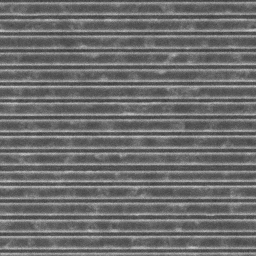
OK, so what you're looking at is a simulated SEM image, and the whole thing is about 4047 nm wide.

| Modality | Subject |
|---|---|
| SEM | parallel lines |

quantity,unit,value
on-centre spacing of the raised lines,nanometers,264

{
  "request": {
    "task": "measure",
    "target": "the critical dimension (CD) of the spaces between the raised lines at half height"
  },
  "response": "65.2 nanometres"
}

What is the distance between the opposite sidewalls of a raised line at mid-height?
0.192 um